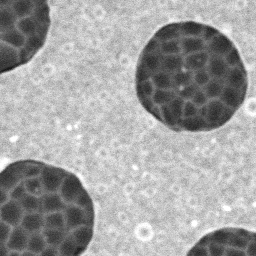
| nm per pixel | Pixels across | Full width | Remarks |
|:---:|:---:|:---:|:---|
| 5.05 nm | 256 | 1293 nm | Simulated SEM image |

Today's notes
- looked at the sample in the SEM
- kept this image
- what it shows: holes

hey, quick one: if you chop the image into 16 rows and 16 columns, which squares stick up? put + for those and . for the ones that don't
...+++++++++++++
...++++++++..+++
...++++++.....++
..+++++++......+
++++++++.......+
++++++++.......+
+++++++++......+
++++++++++....++
++++++++++++++++
++++++++++++++++
....++++++++++++
.....+++++++++++
......++++++++++
......++++++++++
......+++++++...
.....+++++++....